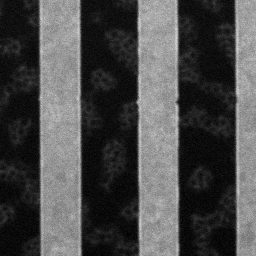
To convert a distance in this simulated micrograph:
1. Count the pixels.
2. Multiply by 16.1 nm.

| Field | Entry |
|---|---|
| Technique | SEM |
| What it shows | one or a few lines or trenches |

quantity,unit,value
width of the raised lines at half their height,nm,610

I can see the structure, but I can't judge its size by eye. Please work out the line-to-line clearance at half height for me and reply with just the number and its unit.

969 nanometers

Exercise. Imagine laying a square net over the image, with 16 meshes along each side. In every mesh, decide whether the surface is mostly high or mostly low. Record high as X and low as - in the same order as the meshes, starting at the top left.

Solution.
---XX----XX----X
---XX----XX----X
---XX----XX----X
---XX----XX----X
---XX----XX----X
---XX----XX----X
---XX----XX----X
---XX----XX----X
---XX----XX----X
---XX----XX----X
---XX----XX----X
---XX----XX----X
---XX----XX----X
---XX----XX----X
---XX----XX----X
---XX----XX----X